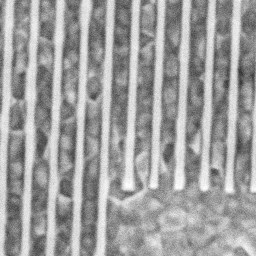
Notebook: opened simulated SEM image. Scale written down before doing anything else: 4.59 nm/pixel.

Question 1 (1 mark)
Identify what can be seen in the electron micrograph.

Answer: parallel lines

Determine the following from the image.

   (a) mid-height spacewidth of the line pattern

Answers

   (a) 18.6 px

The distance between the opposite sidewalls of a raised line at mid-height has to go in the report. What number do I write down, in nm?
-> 27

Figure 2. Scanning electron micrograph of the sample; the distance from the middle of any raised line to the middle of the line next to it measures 116 nanometres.